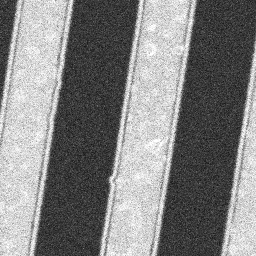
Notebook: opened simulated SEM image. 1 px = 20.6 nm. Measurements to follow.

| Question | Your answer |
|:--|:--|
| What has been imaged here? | one or a few lines or trenches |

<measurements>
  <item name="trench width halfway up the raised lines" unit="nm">1060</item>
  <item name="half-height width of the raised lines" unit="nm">1430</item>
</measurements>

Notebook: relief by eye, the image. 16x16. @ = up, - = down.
@---@@@@@---@@@@
@---@@@@@---@@@@
@---@@@@----@@@@
@---@@@@----@@@@
@---@@@@---@@@@@
----@@@@---@@@@@
---@@@@@---@@@@@
---@@@@@---@@@@-
---@@@@@---@@@@-
---@@@@----@@@@-
---@@@@----@@@@-
---@@@@---@@@@@-
---@@@@---@@@@@-
--@@@@@---@@@@--
--@@@@@---@@@@--
--@@@@----@@@@--